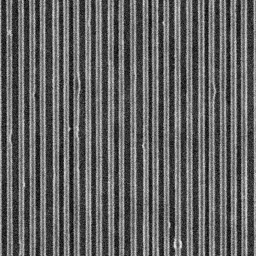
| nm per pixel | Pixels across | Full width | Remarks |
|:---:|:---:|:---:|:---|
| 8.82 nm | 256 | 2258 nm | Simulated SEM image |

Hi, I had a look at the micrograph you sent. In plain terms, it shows parallel lines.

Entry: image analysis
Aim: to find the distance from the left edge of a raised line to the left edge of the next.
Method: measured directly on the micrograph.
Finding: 98.5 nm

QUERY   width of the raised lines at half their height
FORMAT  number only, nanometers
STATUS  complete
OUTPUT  43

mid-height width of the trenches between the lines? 51.8 nanometers